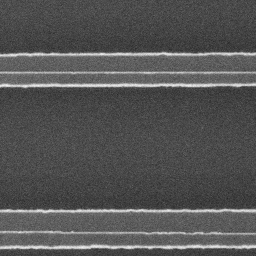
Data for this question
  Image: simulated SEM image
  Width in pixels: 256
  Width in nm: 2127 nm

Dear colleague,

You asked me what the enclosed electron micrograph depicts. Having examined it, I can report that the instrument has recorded lines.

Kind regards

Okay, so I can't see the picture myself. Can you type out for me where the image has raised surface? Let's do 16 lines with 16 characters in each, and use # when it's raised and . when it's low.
................
................
................
################
################
................
................
................
................
................
................
................
................
################
################
................